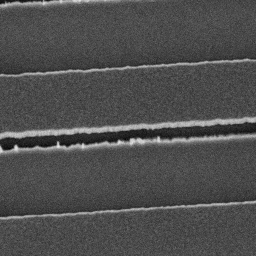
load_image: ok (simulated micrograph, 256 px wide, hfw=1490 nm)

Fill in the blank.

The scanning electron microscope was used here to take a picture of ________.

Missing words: lines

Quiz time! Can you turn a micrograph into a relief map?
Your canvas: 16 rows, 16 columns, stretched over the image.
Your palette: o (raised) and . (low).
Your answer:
................
................
................
................
...ooooooooooooo
oooooooooooooooo
oooooooooooooooo
oooooooooooooooo
o...............
................
................
................
................
.ooooooooooooooo
oooooooooooooooo
oooooooooooooooo